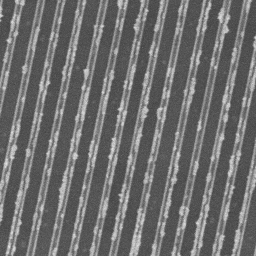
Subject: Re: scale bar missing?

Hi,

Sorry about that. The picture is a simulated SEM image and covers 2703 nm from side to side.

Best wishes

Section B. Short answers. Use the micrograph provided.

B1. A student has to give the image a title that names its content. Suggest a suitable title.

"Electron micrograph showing parallel lines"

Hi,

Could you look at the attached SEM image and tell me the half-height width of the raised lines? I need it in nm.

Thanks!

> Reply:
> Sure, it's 64.7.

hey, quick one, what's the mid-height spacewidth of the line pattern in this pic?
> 13.7 px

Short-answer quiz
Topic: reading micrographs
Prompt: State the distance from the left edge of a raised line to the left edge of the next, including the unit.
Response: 213 nanometers